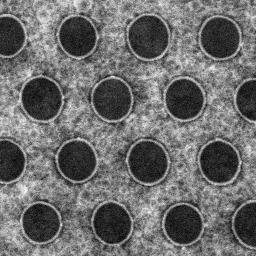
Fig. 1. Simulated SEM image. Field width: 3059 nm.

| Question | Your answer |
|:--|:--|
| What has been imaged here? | a regular array of raised bodies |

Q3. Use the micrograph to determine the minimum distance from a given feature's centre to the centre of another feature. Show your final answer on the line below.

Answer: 0.848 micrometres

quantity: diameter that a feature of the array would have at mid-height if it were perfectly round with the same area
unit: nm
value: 503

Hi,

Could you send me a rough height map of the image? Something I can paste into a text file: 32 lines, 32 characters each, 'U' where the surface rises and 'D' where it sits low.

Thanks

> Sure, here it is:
DDDDDDDDDDUDDDDDDDDDDDDDDDDDDDDD
DDDDDUDDDDDDDDDDDDDDDDDDDDDDDDDD
UUDDDDDDUUUDDDDDDUUUDDDDDDUUUDDD
UUUDDDDUUUUUDDDDUUUUUDDDDUUUUUDD
UUUDDDDUUUUUDDDDUUUUUDDDDUUUUUDD
UUUDDDDDUUUUDDDDUUUUUDDDDUUUUUDD
UUDDDDDDUUUDDDDDDUUUUDDDDDUUUUDD
DDDDDDDDDDDDDDDDDDDDDDDDDDDDDDDD
DDDDDDDDDDDDDDDDDDDDDDDDDDDDDDDD
DDDDDDDDDDDDDDDDDDDDDDDDDDDDDDDD
DDDUUUUDDDDDUUUUDDDDDUUUUDDDDDUU
DDDUUUUUDDDDUUUUDDDDDUUUUDDDDDUU
DDDUUUUUDDDDUUUUDDDDDUUUUUDDDUUU
DDDUUUUUDDDDUUUUDDDDDUUUUDDDDDUU
DDDDUUUDDDDDUUUUDDDDDUUUUDDDDDUU
DDDDDDDDDDDDDDDDDDDDDDDDDDDDDDDD
DDDDDDDDDDDDDDDDDDDDDDDDDDDDDDDD
UDDDDDDDDUDDDDDDDDDDDDDDDDDUDDDD
UUUDDDDDUUUUDDDDUUUUDDDDDUUUUDDD
UUUDDDDUUUUUDDDDUUUUUDDDDUUUUUDD
UUUDDDDUUUUUDDDDUUUUUDDDDUUUUUDD
UUUDDDDDUUUUDDDDUUUUUDDDDUUUUUDD
UUDDDDDDDUUDDDDDDUUUDDDDDDUUUDDD
DDDDDDDDDDDDDDDDDDDDDDDDDDDDDDDD
DDDDDDDDDDDDDDDDDDDDDDDDDDDDDDDD
DDDDUUDDDDDDDUUDDDDDDDUDDDDDDDDU
DDDUUUUDDDDDUUUUDDDDDUUUUDDDDDUU
DDDUUUUUDDDDUUUUDDDDUUUUUDDDDUUU
DDDUUUUDDDDDUUUUDDDDUUUUUDDDDUUU
DDDUUUUDDDDDUUUUDDDDDUUUUDDDDDUU
DDDDDDDDDDDDDUUDDDDDDDUUDDDDDDUU
DDDDDDDDDDDDDDDDDDDDDDDDDDDDDDDD